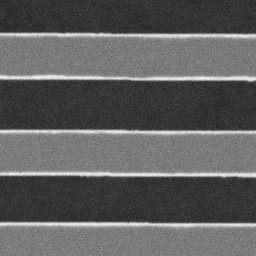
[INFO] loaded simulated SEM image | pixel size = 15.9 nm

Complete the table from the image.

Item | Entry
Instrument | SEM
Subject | lines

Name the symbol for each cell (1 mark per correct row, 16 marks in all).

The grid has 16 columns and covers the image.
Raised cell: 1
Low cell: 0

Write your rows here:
0000000000000000
0000000000000000
1111111111111111
1111111111111111
1111111111111111
0000000000000000
0000000000000000
0000000000000000
1111111111111111
1111111111111111
1111111111111111
0000000000000000
0000000000000000
0000000000000000
1111111111111111
1111111111111111